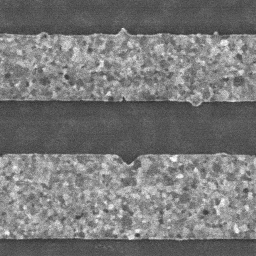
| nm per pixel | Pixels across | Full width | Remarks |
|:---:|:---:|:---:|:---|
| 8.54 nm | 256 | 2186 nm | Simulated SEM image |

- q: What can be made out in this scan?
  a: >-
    one or a few lines or trenches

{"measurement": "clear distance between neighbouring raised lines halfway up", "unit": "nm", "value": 464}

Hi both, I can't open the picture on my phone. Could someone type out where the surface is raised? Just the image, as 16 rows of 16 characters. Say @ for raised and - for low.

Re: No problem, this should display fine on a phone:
----------------
----------------
@@@@@@@@@@@@@@@@
@@@@@@@@@@@@@@@@
@@@@@@@@@@@@@@@@
@@@@@@@@@@@@@@@@
----------------
----------------
----------------
----------------
@@@@@@@@@@@@@@@@
@@@@@@@@@@@@@@@@
@@@@@@@@@@@@@@@@
@@@@@@@@@@@@@@@@
@@@@@@@@@@@@@@@@
----------------